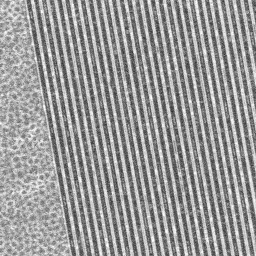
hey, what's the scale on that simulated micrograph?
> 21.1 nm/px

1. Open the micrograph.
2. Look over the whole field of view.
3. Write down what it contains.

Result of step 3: parallel lines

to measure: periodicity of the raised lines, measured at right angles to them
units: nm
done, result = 161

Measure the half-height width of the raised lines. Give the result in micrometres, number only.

0.039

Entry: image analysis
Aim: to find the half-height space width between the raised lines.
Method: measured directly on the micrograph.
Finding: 0.112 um